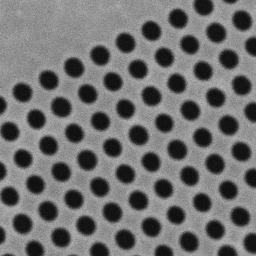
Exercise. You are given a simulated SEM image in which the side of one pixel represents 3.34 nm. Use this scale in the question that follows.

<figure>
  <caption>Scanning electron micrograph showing a regular array of holes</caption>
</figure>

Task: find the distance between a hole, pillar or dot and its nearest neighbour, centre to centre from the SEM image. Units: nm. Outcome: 94.6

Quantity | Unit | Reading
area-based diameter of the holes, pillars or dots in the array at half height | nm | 65.2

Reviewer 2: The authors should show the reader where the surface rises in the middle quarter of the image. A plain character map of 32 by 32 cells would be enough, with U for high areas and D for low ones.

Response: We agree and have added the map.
DDDDDUUUUUUUUUUUDDDDDUUUDDUUUUUU
DDDDDUUUUUUUUUUUDDDDDUUUUUUUUUUU
UDDDDUUUUUUDDDUUUDDDDUUUUUUDDUUU
UUDUUUUUUUDDDDUUUUDDUUUUUUDDDDUU
UUUUUUUUUUDDDDDUUUUUUUUUUUDDDDUU
UUUUDDDUUUDDDDUUUUUUUUUUUUDDDDDU
UUUUDDDDUUUDDDUUUUUUDDDDUUUDDDUU
UUUDDDDDUUUUUUUUUUUDDDDDUUUUUUUU
UUUUDDDDUUUUUUUUUUUDDDDDUUUUUUUU
DUUUUDDUUUUUUUDDDUUUDDDDUUUUUUDD
DDUUUUUUUUUUUDDDDDUUUDDUUUUUUDDD
DDUUUUUUUUUUUDDDDDUUUUUUUUUUUDDD
DUUUUUUDDDUUUDDDDUUUUUUUDUUUUDDD
UUUUUUUDDDDUUUDDUUUUUUUDDDDUUUDD
UUUUUUUDDDDDUUUUUUUUUUUDDDDUUUUU
UDDDUUUDDDDUUUUUUDDUUUUDDDDUUUUU
DDDDDUUUDDUUUUUUDDDDDUUUDDDUUUUU
DDDDDUUUUUUUUUUUDDDDDUUUUUUUUUUU
UDDDDUUUUUUUUUUUDDDDDUUUUUUUUUUU
UUDDUUUUUUDDDDUUUDDDDUUUUUUDDDUU
UUUUUUUUUUDDDDUUUUUUUUUUUUDDDDUU
UUUUUDUUUUDDDDUUUUUUUUUUUUDDDDDU
UUUUDDDDUUDDDDUUUUUUDDDUUUDDDDDU
UUUDDDDDUUUUUUUUUUUUDDDDUUUDDDUU
UUUDDDDDUUUUUUUUUUUDDDDDUUUUUUUU
DUUUDDDDUUUUUUDDUUUUDDDDUUUUUUUU
DDUUUDDUUUUUUDDDDUUUUDDDUUUUUDDD
DDUUUUUUUUUUUDDDDDUUUUUUUUUUUDDD
DUUUUUUUDDUUUDDDDDUUUUUUUUUUUDDD
UUUUUUUDDDDUUUDDDUUUUUUDDDUUUUDD
UUUUUUUDDDDUUUUUUUUUUUUDDDDUUUUU
UDDUUUUDDDDUUUUUUUUUUUUDDDDUUUUU